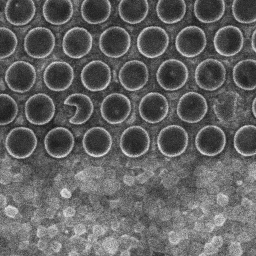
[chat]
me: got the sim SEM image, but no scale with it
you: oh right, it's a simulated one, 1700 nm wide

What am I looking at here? a regular array of raised bodies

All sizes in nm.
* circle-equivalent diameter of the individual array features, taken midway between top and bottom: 197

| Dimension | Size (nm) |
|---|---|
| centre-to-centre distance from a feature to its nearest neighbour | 250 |